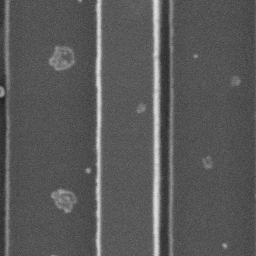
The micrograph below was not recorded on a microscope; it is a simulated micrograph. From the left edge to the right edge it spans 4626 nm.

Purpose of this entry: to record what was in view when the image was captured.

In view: lines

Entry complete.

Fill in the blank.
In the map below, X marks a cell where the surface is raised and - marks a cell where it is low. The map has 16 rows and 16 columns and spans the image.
------XXXX------
------XXXX------
------XXXX------
------XXXX------
------XXXX------
------XXXX------
------XXXX------
------XXXX------
------XXXX------
------XXXX------
------XXXX------
------XXXX------
------XXXX------
------XXXX------
------XXXX------
------XXXX------